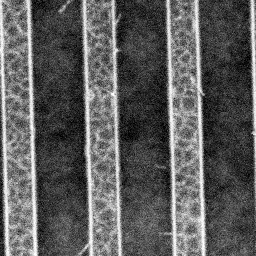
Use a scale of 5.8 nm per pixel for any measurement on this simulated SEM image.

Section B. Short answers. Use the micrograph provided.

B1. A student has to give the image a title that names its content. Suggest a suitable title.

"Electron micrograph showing one or a few lines or trenches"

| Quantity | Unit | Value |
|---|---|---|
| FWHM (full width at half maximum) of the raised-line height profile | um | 0.165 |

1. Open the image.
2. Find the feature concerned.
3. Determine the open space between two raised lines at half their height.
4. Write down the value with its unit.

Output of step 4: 56 px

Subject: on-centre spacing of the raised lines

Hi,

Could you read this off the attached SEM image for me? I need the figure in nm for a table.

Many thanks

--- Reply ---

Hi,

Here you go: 487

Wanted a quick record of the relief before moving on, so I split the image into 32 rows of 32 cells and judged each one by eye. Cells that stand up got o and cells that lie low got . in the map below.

oooo.......ooo.......oooo.......
oooo.......ooo.......oooo.......
oooo.......ooo.......oooo.......
oooo.......ooo.......oooo.......
oooo.......ooo.......oooo.......
oooo.......ooo.......oooo.......
oooo.......ooo.......oooo.......
oooo.......ooo.......oooo.......
oooo.......ooo.......oooo.......
oooo.......ooo.......oooo.......
oooo.......ooo.......oooo.......
oooo.......ooo.......oooo.......
oooo.......ooo.......oooo.......
.ooo.......ooo.......oooo.......
.ooo.......ooo.......oooo.......
.ooo.......ooo.......oooo.......
.ooo.......oooo......oooo.......
.ooo.......oooo.......ooo.......
.ooo.......oooo.......ooo.......
.ooo.......oooo.......ooo.......
.ooo.......oooo.......ooo.......
.ooo.......oooo.......ooo.......
.ooo.......oooo.......ooo.......
.ooo.......oooo.......ooo.......
.ooo.......oooo.......ooo.......
.ooo.......oooo.......ooo.......
.ooo.......oooo.......ooo.......
.ooo.......oooo.......ooo.......
.ooo.......oooo.......ooo.......
.ooo.......oooo.......ooo.......
.ooo.......oooo.......ooo.......
.ooo.......oooo.......ooo.......